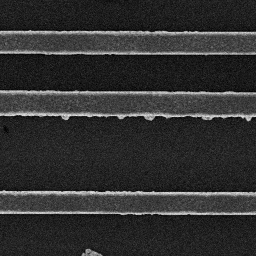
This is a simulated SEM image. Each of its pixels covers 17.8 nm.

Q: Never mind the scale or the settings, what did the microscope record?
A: lines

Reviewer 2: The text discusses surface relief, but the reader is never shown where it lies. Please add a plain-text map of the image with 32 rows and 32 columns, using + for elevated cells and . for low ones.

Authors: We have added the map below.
................................
................................
................................
................................
++++++++++++++++++++++++++++++++
++++++++++++++++++++++++++++++++
++++++++++++++++++++++++++++++++
................................
................................
................................
................................
.+++..+.........................
++++++++++++++++++++++++++++++++
++++++++++++++++++++++++++++++++
...........+...+....+++.++++++++
................................
................................
................................
................................
................................
................................
................................
................................
................................
++++++++++++++++++++++++++++++++
++++++++++++++++++++++++++++++++
++++++++++++++++++++++++++++++++
................................
................................
................................
................................
................................